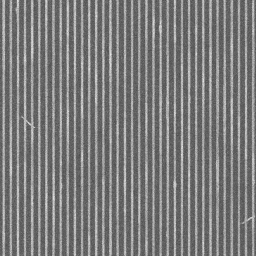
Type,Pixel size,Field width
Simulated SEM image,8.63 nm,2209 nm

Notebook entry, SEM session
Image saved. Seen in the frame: parallel lines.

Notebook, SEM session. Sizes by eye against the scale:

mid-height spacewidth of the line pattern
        47.5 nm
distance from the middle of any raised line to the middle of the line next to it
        61.6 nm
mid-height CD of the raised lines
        0.0151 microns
